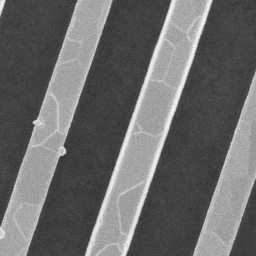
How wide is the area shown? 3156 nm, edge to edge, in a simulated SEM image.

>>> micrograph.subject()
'lines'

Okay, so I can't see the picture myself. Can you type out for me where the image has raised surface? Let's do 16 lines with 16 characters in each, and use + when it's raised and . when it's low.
.....++....++...
....+++...+++...
....++....++....
....++....++....
...+++...+++....
...++....++.....
...++....++....+
..++....+++....+
..++....++.....+
..++....++....++
.++....+++....++
.++....++.....++
.++....++....++.
++....+++....++.
++....++.....++.
++...+++....++..